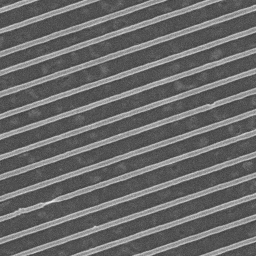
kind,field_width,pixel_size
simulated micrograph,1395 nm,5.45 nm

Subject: parallel lines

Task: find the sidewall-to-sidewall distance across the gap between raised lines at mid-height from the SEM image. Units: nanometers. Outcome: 83.1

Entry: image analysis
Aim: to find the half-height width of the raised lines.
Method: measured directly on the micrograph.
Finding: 4.37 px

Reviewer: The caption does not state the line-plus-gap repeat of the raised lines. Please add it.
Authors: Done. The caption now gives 108 nm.